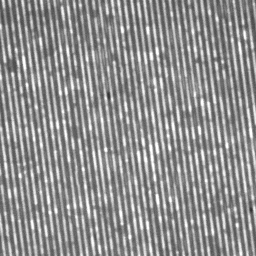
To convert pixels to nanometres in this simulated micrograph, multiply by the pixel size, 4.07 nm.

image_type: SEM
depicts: parallel lines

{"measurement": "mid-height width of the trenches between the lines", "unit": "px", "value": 4.59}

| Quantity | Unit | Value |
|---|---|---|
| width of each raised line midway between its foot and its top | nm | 8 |